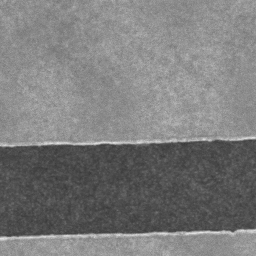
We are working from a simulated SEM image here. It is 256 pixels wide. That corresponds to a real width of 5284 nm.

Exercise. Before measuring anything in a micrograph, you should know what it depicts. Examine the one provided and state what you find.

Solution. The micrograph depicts one or a few lines or trenches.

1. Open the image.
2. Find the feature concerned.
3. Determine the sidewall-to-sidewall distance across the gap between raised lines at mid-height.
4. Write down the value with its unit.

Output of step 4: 1910 nanometres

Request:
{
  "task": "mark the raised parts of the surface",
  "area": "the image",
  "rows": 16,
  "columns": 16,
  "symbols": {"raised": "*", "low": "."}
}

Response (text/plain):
****************
****************
****************
****************
****************
****************
****************
****************
****************
................
................
................
................
................
...............*
****************